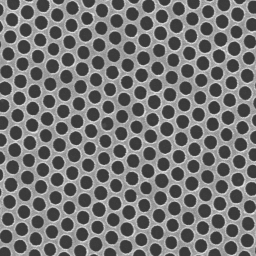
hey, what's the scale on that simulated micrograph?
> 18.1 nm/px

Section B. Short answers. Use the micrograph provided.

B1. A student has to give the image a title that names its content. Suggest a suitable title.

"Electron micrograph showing a regular array of holes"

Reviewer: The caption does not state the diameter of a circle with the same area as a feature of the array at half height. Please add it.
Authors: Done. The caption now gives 240 nm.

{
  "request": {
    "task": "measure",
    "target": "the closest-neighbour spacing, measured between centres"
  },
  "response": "304 nanometres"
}